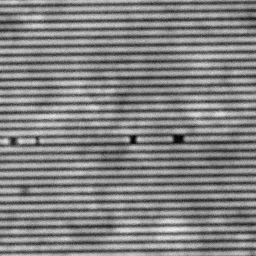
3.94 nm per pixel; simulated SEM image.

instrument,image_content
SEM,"parallel lines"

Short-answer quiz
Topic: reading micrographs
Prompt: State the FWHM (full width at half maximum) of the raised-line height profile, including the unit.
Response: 23.6 nanometers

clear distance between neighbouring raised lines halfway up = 7.9 nanometers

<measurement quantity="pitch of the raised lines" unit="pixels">8.2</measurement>